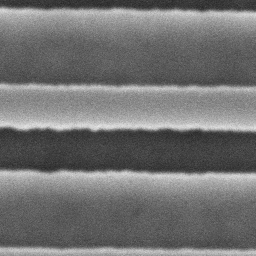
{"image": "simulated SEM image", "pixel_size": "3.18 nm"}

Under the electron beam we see lines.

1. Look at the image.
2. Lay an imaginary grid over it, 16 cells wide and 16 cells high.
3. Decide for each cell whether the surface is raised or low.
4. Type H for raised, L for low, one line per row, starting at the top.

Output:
LLLLLLLLLLLLLLLL
HHHHHHHHHHHHHHHH
HHHHHHHHHHHHHHHH
HHHHHHHHHHHHHHHH
HHHHHHHHHHHHHHHH
HHHHHHHHHHHHHHHH
HHHHHHHHHHHHHHHH
HHHHHHHHHHHHHHHH
LLLLLLLLLLLLLLLL
LLLLLLLLLLLLLLLL
LLLLLLLLLLLLLLLL
HHHHHHHHHHHHHHHH
HHHHHHHHHHHHHHHH
HHHHHHHHHHHHHHHH
HHHHHHHHHHHHHHHH
HHHHHHHHHHHHHHHH